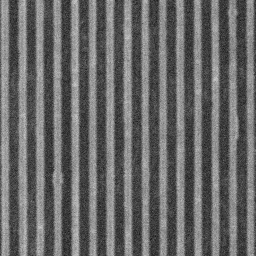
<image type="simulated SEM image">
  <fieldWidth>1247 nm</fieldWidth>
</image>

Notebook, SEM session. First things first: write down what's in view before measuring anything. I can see parallel lines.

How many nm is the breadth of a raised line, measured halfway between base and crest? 28.6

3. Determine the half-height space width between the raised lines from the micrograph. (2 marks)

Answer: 11.7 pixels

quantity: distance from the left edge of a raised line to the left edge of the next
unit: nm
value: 85.2